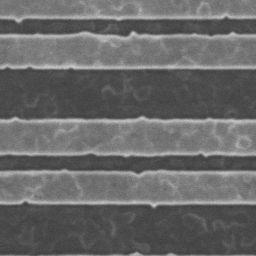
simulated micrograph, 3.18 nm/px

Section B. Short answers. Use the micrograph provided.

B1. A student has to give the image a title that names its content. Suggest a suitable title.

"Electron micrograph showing one or a few lines or trenches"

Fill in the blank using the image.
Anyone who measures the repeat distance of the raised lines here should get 216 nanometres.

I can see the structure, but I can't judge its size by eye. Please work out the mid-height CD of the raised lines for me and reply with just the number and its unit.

107 nanometres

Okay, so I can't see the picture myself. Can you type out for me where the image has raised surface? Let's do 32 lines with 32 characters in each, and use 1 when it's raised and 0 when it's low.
11111111111111111111111111111111
11111111111111111111111111111111
00100000000000000000000000000000
00000000000000000000000000000000
11111111111111101110111111011111
11111111111111111111111111111111
11111111111111111111111111111111
11111111111111111111111111111111
10001111111111111111111111111111
00000000000000000000000000000000
00000000000000000000000000000000
00000000000000000000000000000000
00000000000000000000000000000000
00000000000000000000000000000000
00000000000000000000000000000000
11111111111111111111111111111111
11111111111111111111111111111111
11111111111111111111111111111111
11111111111111111111111111111111
00000000000000000000000000000000
00000000000000000000000000000000
00111111100000000001100000000000
11111111111111111111111111111111
11111111111111111111111111111111
11111111111111111111111111111111
00000000000000000011111000000000
00000000000000000000000000000000
00000000000000000000000000000000
00000000000000000000000000000000
00000000000000000000000000000000
00000000000000000000000000000000
00000000000000000000000000000000